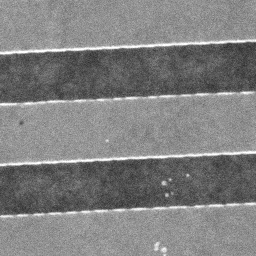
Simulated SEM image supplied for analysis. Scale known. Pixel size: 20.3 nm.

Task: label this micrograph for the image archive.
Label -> lines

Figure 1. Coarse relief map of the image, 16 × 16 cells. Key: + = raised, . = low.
++++++++++++++++
++++++++++++++++
++++++++++++++++
................
................
................
.+++++++++++++++
++++++++++++++++
++++++++++++++++
++++++++++++++++
................
................
................
.+++++++++++++++
++++++++++++++++
++++++++++++++++